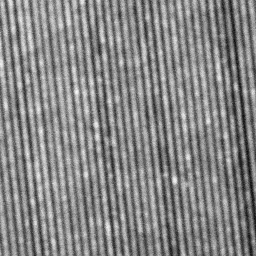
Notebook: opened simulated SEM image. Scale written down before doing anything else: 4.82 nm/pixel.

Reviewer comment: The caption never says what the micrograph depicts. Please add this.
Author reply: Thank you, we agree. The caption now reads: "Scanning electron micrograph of parallel lines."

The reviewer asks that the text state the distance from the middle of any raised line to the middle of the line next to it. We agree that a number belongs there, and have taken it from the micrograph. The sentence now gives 7.97 pixels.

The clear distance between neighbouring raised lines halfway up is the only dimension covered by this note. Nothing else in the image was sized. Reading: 12 nm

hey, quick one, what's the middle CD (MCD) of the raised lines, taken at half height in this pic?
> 28.1 nm